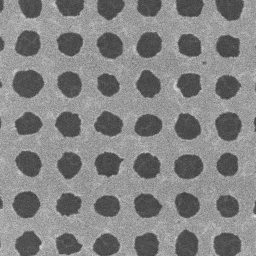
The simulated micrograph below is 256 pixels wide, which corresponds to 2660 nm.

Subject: a regular array of holes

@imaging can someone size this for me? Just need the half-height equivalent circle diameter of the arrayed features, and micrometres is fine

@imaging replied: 0.273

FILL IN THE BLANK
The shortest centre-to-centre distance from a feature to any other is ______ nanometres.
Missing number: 406